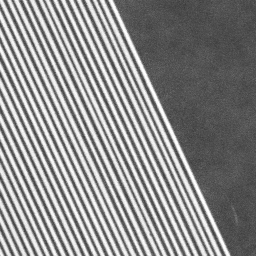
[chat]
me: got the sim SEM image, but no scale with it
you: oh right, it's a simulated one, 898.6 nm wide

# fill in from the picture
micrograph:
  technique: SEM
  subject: parallel lines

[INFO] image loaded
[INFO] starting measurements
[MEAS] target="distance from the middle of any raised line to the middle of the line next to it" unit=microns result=0.0249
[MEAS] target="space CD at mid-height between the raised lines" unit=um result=0.0131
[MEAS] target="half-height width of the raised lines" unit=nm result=13.1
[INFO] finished